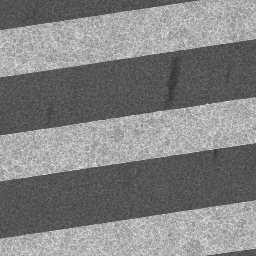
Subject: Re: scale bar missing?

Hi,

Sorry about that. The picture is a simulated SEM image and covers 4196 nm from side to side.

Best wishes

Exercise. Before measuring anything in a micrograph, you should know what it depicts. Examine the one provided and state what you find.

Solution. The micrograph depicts one or a few lines or trenches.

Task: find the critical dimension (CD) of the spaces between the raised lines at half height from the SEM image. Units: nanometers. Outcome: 938